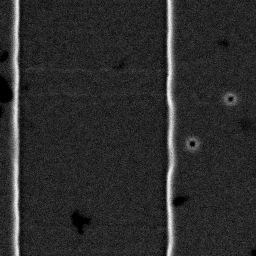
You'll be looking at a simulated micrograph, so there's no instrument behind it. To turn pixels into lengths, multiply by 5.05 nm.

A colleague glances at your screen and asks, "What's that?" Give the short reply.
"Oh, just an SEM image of wiring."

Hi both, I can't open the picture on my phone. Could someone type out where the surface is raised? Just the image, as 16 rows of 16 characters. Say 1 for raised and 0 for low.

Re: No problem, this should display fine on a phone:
1000000000011111
1000000000011111
1000000000011111
1000000000011111
1000000000111111
1000000000111111
1000000000011111
1000000000011111
1000000000011111
1000000000011111
1000000000011111
1000000000111111
1000000000111111
1000000000011111
1000000000011111
1000000000111111